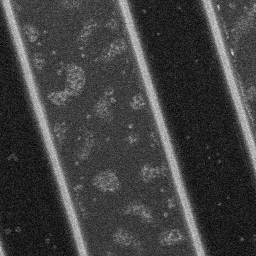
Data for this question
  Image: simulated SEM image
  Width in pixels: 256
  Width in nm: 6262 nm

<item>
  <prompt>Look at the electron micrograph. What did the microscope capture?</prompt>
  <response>one or a few lines or trenches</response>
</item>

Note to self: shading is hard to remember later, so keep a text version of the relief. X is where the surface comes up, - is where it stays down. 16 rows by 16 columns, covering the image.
XXXXXXXX-----XXX
-XXXXXXX-----XXX
-XXXXXXX------XX
-XXXXXXXX-----XX
--XXXXXXX-----XX
--XXXXXXX------X
--XXXXXXXX-----X
---XXXXXXX-----X
---XXXXXXX-----X
---XXXXXXXX-----
----XXXXXXX-----
----XXXXXXX-----
----XXXXXXXX----
----XXXXXXXX----
-----XXXXXXX----
-----XXXXXXX----